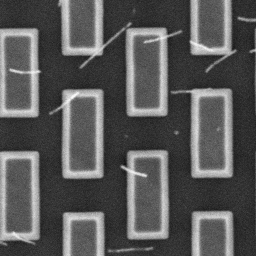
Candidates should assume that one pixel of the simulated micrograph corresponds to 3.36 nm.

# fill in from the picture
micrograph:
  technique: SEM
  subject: groups of lines, slits or small figures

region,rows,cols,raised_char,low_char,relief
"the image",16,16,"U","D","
DDDDUUDDDDDDUUDD
DDDDUUDDDDDDUUDD
UUDDUUDDUUDDUUDD
UUDDDDDDUUDDDDDD
UUDDDDDDUUDDDDDD
UUDDDDDDUUDDDDDD
UUDDUUDDUUDDUUDD
DDDDUUDDDDDDUUDD
DDDDUUDDDDDDUUDD
DDDDUUDDDDDDUUDD
UUDDUUDDUUDDUUDD
UUDDDDDDUUDDDDDD
UUDDDDDDUUDDDDDD
UUDDDUDDUUDDDUDD
UUDDUUDDUUDDUUDD
DDDDUUDDDDDDUUDD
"